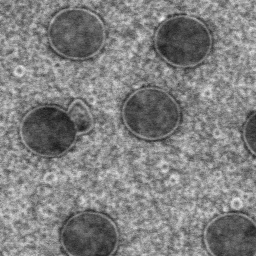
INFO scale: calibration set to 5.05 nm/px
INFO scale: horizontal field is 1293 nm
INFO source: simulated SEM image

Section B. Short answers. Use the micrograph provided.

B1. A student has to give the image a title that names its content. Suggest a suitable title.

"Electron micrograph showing raised bodies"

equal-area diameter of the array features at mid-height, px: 53.5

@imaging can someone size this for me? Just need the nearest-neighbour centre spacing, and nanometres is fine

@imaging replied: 445